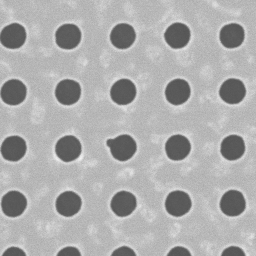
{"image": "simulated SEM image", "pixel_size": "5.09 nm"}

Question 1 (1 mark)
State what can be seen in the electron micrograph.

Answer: a regular array of holes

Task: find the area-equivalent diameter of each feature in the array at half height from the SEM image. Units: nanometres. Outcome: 135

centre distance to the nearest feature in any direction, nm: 278